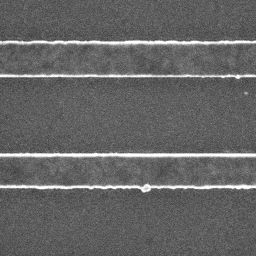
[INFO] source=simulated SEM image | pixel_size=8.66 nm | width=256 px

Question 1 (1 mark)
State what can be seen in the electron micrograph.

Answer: lines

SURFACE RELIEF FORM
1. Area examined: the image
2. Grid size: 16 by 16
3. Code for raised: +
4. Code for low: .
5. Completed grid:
................
................
................
++++++++++++++++
++++++++++++++++
................
................
................
................
................
++++++++++++++++
++++++++++++++++
................
................
................
................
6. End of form